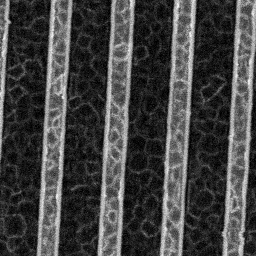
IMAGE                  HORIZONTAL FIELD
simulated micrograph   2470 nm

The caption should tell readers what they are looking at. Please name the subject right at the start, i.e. one or a few lines or trenches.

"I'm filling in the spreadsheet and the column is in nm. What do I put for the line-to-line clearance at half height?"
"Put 419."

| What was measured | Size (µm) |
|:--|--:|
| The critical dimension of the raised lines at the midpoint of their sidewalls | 0.173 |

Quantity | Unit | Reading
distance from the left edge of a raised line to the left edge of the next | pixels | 61.8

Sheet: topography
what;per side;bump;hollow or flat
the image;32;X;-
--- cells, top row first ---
X------XX-----XXX-----XX------XX
X------XX-----XXX-----XX------XX
X-----XXX-----XX------XX------XX
X-----XXX-----XX------XX------XX
X-----XXX-----XX------XX------XX
X-----XX------XX------XX------XX
X-----XX------XX------XX-----XXX
X-----XX------XX------XX-----XXX
------XX------XX------XX-----XX-
------XX------XX------XX-----XX-
------XX------XX-----XXX-----XX-
------XX------XX-----XXX-----XX-
------XX------XX-----XXX-----XX-
------XX-----XXX-----XXX-----XX-
------XX-----XXX-----XXX-----XX-
------XX-----XXX-----XX------XX-
------XX-----XXX-----XX------XX-
------XX-----XXX-----XX------XX-
------XX-----XXX-----XX------XX-
------XX-----XXX-----XX------XX-
-----XXX-----XX------XX------XX-
-----XXX-----XX------XX------XX-
-----XXX-----XX------XX------XX-
-----XX------XX------XX-----XXX-
-----XX------XX------XX-----XXX-
-----XX------XX-----XXX-----XXX-
-----XX------XX------XX-----XX--
-----XX------XX------XX-----XX--
-----XX------XX-----XXX-----XX--
-----XX------XX-----XXX-----XX--
-----XX------XX-----XXX-----XX--
-----XX------XX-----XXX-----XX--